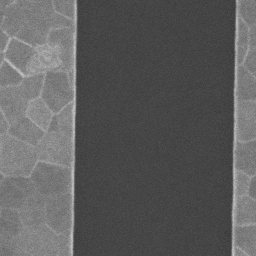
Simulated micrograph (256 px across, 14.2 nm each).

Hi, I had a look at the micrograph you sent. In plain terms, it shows wiring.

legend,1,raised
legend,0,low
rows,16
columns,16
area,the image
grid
1111100000000001
1111100000000001
1111100000000001
1111100000000001
1111100000000001
1111100000000001
1111100000000001
1111100000000001
1111100000000001
1111100000000001
1111100000000001
1111100000000001
1111100000000001
1111100000000001
1111100000000001
1111000000000001